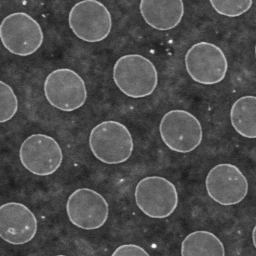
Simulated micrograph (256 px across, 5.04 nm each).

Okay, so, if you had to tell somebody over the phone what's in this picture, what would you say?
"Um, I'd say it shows a regular array of raised bodies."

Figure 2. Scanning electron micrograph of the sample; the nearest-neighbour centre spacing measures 353 nm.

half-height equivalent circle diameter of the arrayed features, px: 41.2